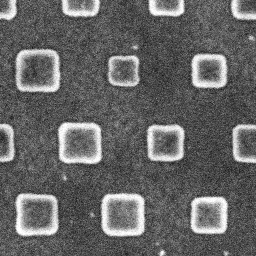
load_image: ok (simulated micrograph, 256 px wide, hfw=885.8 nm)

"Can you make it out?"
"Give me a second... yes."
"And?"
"raised bodies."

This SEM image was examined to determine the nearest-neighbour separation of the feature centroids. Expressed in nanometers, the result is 289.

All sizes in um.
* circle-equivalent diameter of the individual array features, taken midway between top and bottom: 0.136